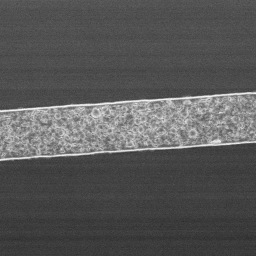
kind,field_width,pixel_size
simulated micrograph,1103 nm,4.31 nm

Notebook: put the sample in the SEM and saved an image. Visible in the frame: one or a few lines or trenches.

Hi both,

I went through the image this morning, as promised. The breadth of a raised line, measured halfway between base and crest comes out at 213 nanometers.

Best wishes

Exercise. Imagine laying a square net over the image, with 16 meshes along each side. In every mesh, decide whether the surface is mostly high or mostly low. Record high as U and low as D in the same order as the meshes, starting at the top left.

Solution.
DDDDDDDDDDDDDDDD
DDDDDDDDDDDDDDDD
DDDDDDDDDDDDDDDD
DDDDDDDDDDDDDDDD
DDDDDDDDDDDDDDDD
DDDDDDDDDDDDDDDD
DDDDDDUUUUUUUUUU
UUUUUUUUUUUUUUUU
UUUUUUUUUUUUUUUU
UUUUUUDDDDDDDDDD
DDDDDDDDDDDDDDDD
DDDDDDDDDDDDDDDD
DDDDDDDDDDDDDDDD
DDDDDDDDDDDDDDDD
DDDDDDDDDDDDDDDD
DDDDDDDDDDDDDDDD